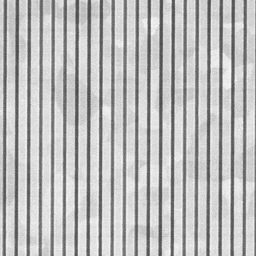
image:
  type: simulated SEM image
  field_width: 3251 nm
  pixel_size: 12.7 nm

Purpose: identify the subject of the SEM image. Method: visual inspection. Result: parallel lines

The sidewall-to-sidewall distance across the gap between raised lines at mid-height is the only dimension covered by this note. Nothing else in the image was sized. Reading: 44.4 nm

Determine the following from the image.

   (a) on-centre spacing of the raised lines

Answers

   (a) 152 nm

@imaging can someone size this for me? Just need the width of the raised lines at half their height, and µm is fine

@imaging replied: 0.1